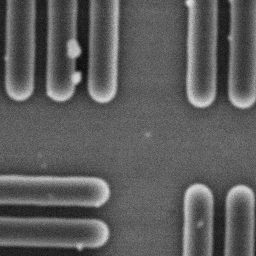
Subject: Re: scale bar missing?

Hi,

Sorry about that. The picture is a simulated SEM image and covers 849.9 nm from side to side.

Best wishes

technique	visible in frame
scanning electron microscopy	groups of lines, slits or small figures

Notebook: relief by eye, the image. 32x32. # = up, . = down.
.###..###..####........####..###
.###..###..####.........###..###
.###..###..####.........###..###
.###..###..####.........###..###
.###..###..####.........###..###
.###..####.####.........###..###
.###..####.####.........###..###
.###..###..####.........###..###
.###..###..####.........###..###
.###..####.####.........###..###
.###..####.###..........###..###
.###..###..###..........###..###
............##..........###..###
................................
................................
................................
................................
................................
................................
................................
................................
................................
#############...................
#############...........##...##.
#############..........####.####
....#########..........####.####
.......................####.####
############...........####.####
#############..........####.####
#############..........###..####
#############..........###..####
.......................###..####